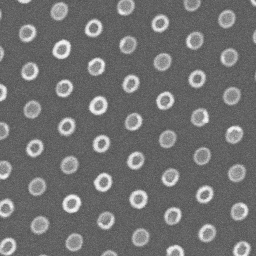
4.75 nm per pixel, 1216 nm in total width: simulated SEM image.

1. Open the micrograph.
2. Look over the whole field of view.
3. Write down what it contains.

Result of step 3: a regular array of raised bodies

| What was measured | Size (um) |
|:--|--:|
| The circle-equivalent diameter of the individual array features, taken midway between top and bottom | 0.079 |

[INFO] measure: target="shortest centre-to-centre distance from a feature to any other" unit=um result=0.182